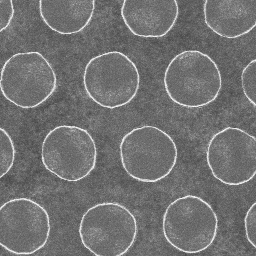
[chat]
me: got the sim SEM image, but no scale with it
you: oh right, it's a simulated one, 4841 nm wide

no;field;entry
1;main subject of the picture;raised bodies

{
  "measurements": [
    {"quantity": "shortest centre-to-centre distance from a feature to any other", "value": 1540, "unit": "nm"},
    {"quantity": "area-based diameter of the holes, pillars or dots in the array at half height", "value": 1030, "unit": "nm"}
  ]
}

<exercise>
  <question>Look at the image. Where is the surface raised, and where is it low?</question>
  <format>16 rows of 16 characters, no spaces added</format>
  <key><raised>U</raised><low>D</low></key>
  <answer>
UDDUUUDDUUUDDUUU
DDDUUDDDUUUDDUUU
DDDDDDDDDDDDDDDD
DUUDDDUUDDDUUDDD
UUUDDUUUUDUUUUDU
UUUDDUUUUDUUUUDU
DUDDDDUUDDDUUDDD
DDDDDDDDDDDDDDDD
DDDUUUDDUUDDDDUU
UDDUUUDDUUUDDUUU
UDDUUUDDUUUDDUUU
DDDDDDDDDDDDDDUD
DUDDDDDDDDDUUDDD
UUUDDUUUDDUUUDDU
UUUDDUUUDDUUUDDU
UUDDDDUUDDDUUDDD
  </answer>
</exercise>